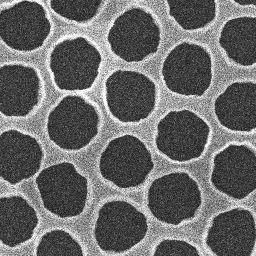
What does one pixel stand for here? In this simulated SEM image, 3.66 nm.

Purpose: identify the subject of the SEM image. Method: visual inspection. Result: a regular array of holes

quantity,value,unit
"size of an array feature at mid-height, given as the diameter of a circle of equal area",192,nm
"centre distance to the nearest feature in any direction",222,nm